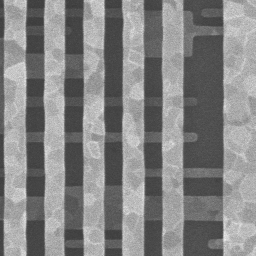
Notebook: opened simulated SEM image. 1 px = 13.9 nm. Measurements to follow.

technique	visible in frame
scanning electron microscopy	wiring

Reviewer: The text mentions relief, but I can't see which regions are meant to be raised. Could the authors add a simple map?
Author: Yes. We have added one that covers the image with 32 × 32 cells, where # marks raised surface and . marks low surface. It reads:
.##...##...##..###..###.....####
.##...##...##..###..###.....####
.##...##..###..###..###.....####
.##...##..###..###..###.....####
.##...##...##..###..###.....####
.##...##...##..###..###.....####
.##...##...##..###..###.....####
.##...##...##..###..###.....####
.##...##...##..###..###.....####
.##...##...##..###..###.....####
.##...##...##..###..###.....####
.##..###...##..###..###.....####
.##..###...##..###..###.....####
.##...##...##..###..###.....####
.##...##..###..###..###.....####
.##...##..###..###..###.....####
.##...##..###..###..###.....####
.##...##..###..###..###.....####
.##...##..###..###..###.....####
.##...##...##..###..###.....####
.##...##...##..###..###.....####
.##...##...##..###..###.....####
.##...##...##..###..###.....####
.##...##...##..###..###.....####
.##...##...##..###..###.....####
.##...##...##..###..###.....####
.##...##...##..###..###.....####
.##...##..###..###..###.....####
.##...##..###..###..###.....####
.##...##...##..###..###.....####
.##...##...##..###..###.....####
.##...##...##..###..###.....####